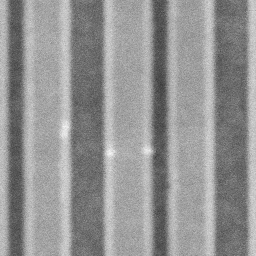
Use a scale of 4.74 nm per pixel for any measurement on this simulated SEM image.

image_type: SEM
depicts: one or a few lines or trenches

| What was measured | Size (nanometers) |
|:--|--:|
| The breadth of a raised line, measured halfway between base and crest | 185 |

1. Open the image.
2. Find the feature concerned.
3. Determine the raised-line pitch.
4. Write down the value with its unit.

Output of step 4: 341 nanometers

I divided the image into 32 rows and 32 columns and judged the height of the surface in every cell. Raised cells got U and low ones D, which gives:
UDDUUUUUDDDDDUUUUUUDDUUUUUDDDDDD
UDDUUUUUDDDDDUUUUUUDDUUUUUDDDDDD
UDDUUUUUDDDDDDUUUUUDDUUUUUDDDDDD
UDDUUUUUDDDDDDUUUUUDDUUUUUDDDDDD
UDDUUUUUDDDDDDUUUUUDDUUUUUDDDDDD
UDDUUUUUDDDDDDUUUUUDDUUUUUDDDDDD
UDDUUUUUDDDDDUUUUUUDDUUUUUDDDDDD
UDDUUUUUDDDDDUUUUUUDDUUUUUDDDDDD
UDDUUUUUDDDDDUUUUUUDDUUUUUDDDDDD
UDDUUUUUDDDDDUUUUUUDDUUUUUDDDDDD
UDDUUUUUDDDDDUUUUUUDDUUUUUDDDDDD
UDDUUUUUDDDDDUUUUUUDDUUUUUDDDDDD
UDDUUUUUDDDDDDUUUUUDDUUUUUDDDDDD
UDDUUUUUDDDDDDUUUUUDDUUUUUDDDDDD
UDDUUUUUDDDDDDUUUUDDDUUUUUDDDDDD
UDDUUUUUDDDDDDUUUUDDDUUUUUDDDDDD
UDDUUUUUDDDDDDUUUUUDDUUUUUDDDDDD
UDDUUUUUDDDDDDUUUUUDDUUUUUDDDDDD
UDDUUUUUDDDDDDUUUUUDDUUUUUDDDDDD
UDDUUUUUDDDDDUUUUUUDDUUUUUDDDDDD
UDDUUUUUDDDDDDUUUUUDDUUUUUDDDDDD
UDDUUUUUDDDDDDUUUUUDDUUUUUDDDDDD
UDDUUUUUDDDDDDUUUUUDDUUUUUDDDDDD
UDDUUUUUDDDDDDUUUUUDDUUUUUDDDDDD
UDDUUUUUDDDDDDUUUUUDDUUUUUDDDDDD
UDDUUUUUDDDDDDUUUUUDDUUUUUDDDDDD
UDDUUUUUDDDDDDUUUUUDDUUUUUDDDDDD
UDDUUUUUDDDDDDUUUUUDDUUUUUDDDDDD
UDDDUUUUDDDDDDUUUUUDDUUUUUDDDDDD
UDDDUUUUDDDDDDUUUUUDDUUUUUDDDDDD
UDDDUUUUDDDDDDUUUUUDDUUUUUDDDDDD
UDDDUUUUDDDDDDUUUUUDDUUUUUDDDDDD